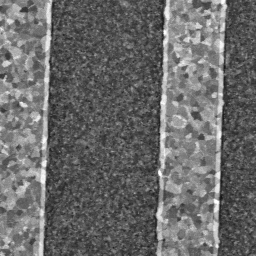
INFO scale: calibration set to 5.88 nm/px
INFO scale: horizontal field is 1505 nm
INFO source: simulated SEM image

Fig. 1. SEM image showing one or a few lines or trenches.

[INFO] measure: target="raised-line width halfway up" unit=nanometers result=332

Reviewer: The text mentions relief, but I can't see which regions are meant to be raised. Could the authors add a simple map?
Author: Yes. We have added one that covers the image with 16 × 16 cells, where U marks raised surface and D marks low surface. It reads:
UUUDDDDDDDUUUUDD
UUUDDDDDDDUUUUDD
UUUDDDDDDDUUUUDD
UUUDDDDDDDUUUUDD
UUUDDDDDDDUUUUDD
UUUDDDDDDDUUUUDD
UUUDDDDDDDUUUUDD
UUUDDDDDDDUUUUDD
UUUDDDDDDDUUUUDD
UUUDDDDDDDUUUUDD
UUUDDDDDDDUUUUDD
UUUDDDDDDDUUUUDD
UUUDDDDDDDUUUUDD
UUUDDDDDDDUUUUDD
UUUDDDDDDDUUUUDD
UUUDDDDDDDUUUUDD